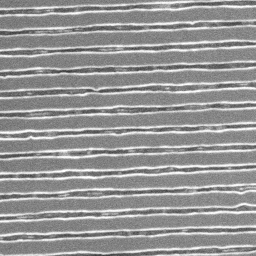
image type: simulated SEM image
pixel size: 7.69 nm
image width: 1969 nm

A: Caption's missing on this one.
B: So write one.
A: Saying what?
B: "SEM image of parallel lines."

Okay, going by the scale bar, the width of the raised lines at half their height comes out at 0.119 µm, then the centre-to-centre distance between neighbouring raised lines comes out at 158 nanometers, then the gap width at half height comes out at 5.49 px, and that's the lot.